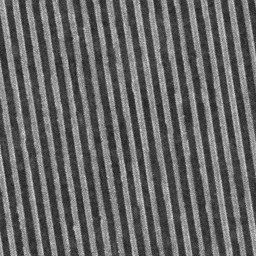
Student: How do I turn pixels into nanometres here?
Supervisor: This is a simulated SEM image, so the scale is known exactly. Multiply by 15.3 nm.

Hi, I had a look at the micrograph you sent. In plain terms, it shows parallel lines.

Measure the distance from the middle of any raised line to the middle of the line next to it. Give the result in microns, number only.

0.204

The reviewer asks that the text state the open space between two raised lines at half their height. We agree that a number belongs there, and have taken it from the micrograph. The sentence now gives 136 nanometres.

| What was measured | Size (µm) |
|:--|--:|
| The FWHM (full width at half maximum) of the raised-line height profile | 0.0679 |